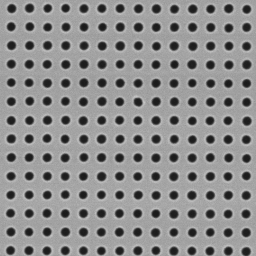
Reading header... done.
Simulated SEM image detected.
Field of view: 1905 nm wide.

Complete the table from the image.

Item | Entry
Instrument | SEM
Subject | a regular array of holes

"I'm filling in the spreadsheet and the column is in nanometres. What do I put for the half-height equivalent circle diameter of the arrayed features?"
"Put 64.5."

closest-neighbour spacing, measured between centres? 0.132 microns